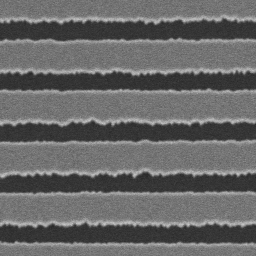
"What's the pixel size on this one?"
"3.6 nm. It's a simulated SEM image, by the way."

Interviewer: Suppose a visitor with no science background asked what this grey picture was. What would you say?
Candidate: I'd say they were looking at lines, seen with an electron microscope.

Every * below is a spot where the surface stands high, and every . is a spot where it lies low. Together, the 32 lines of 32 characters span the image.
********************************
********************************
*************************.******
................................
................................
********************************
********************************
********************************
********************************
................................
................................
********************************
********************************
********************************
********************************
***...***...*.*...***.**........
................................
................................
********************************
********************************
********************************
********************************
................................
................................
********************************
********************************
********************************
********************************
................................
................................
********************************
********************************